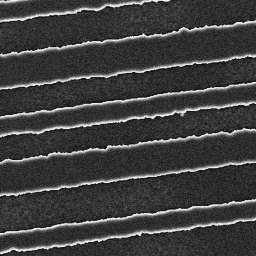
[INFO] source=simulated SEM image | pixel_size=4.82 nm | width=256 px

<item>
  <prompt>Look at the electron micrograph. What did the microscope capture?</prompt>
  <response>lines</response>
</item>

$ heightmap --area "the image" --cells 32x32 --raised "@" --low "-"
@@@@@@@@@@@@@@@@----------------
@@@@@@@@@@----------------------
@@@-----------------------------
-------------------------@@@@@@@
-----------------@@@@@@@@@@@@@@@
----------@@@@@@@@@@@@@@@@@@@@@@
---@@@@@@@@@@@@@@@@@@@@@@@@@@@@@
@@@@@@@@@@@@@@@@@@@@@@@@@@@@@---
@@@@@@@@@@@@@@@@@@@@------------
@@@@@@@@@@@@@@------------------
@@@@@@------------------------@@
-----------------------@@@@@@@@@
----------------@@@@@@@@@@@@@@@@
--------@@@@@@@@@@@@@@@@@@-@----
@@@@@@@@@@@@@@@@@@@@------------
@@@@@@@@@@@@@-------------------
@@@@@@-----------------------@@@
--------------------@@@@@@@@@@@@
-------------@@@@@@@@@@@@@@@@@@@
-----@@@@@@@@@@@@@@@@@@@@@@@@@@@
@@@@@@@@@@@@@@@@@@@@@@@@@@@@@@--
@@@@@@@@@@@@@@@@@@@@@@@---------
@@@@@@@@@@@@@@@-----------------
@@@@@@@@------------------------
--------------------------------
----------------------------@@@@
--------------------@@@@@@@@@@@@
-------------@@@@@@@@@@@@@@@@@@@
-----@@@@@@@@@@@@@@@@@@@--------
@@@@@@@@@@@@@@@@@---------------
@@@@@@@@@@----------------------
@-------------------------------